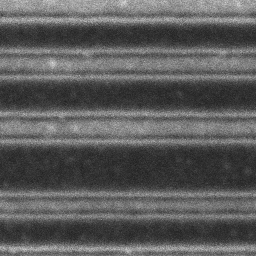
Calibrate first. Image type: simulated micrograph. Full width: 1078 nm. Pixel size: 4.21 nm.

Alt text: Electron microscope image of one or a few lines or trenches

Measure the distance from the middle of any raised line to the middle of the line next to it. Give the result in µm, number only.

0.278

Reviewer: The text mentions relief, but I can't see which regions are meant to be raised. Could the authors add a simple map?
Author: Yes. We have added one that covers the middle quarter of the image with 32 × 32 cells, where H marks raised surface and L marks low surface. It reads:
LLLLLLLLLLLLLLLLLLLLLLLLLLLLLLLL
LLLLLLLLLLLLLLLLLLLLLLLLLLLLLLLL
LLLLLLLLLLLLLLLLLLLLLLLLLLLLLLLL
HHHHHHHHHHHHHHHHHHHHHHHHHHHHHHHH
HHHHHHHHHHHHHHHHHHHHHHHHHHHHHHHH
HHHHHHHHHHHHHHHHHHHHHHHHHHHHHHHH
HHHHHHHHHHHHHHHHHHHHHHHHHHHHHHHH
HHHHHHHHHHHHHHHHHHHHHHHHHHHHHHHH
HHHHHHHHHHHHHHHHHHHHHHHHHHHHHHHH
HHHHHHHHHHHHHHHHHHHHHHHHHHHHHHHH
HHHHHHHHHHHHHHHHHHHHHHHHHHHHHHHH
HHHHHHHHHHHHHHHHHHHHHHHHHHHHHHHH
HHHHHHHHHHHLLHHHHHHHHHHHHHHHHHHH
LLLLLLLLLLLLLLLLLLLLLLLLLLLLLLLL
LLLLLLLLLLLLLLLLLLLLLLLLLLLLLLLL
LLLLLLLLLLLLLLLLLLLLLLLLLLLLLLLL
LLLLLLLLLLLLLLLLLLLLLLLLLLLLLLLL
LLLLLLLLLLLLLLLLLLLLLLLLLLLLLLLL
LLLLLLLLLLLLLLLLLLLLLLLLLLLLLLLL
HHHHHHHHHHHHHHHHHHHHHHHHHHHHHHHH
HHHHHHHHHHHHHHHHHHHHHHHHHHHHHHHH
HHHHHHHHHHHHHHHHHHHHHHHHHHHHHHHH
HHHHHHHHHHHHHHHHHHHHHHHHHHHHHHHH
HHHHHHHHHHHHHHHHHHHHHHHHHHHHHHHH
HHHHHHHHHHHHHHHHHHHHHHHHHHHHHHHH
HHHHHHHHHHHHHHHHHHHHHHHHHHHHHHHH
HHHHHHHHHHHHHHHHHHHHHHHHHHHHHHHH
HHHHHHHHHHHHHHHHHHHHHHHHHHHHHHHH
HHHHHHHHHHHHHHHHHHHHHHHHHHHHHHHH
HHHHHHHHHHHHHHHHHHHHHHHHHHHHHHHH
HHHHHHHHHHHHHHHHHHHHHHHHHHHHHHHH
HHHHHHHHHHHHHHHHHHHHHHHHHHHHHHHH